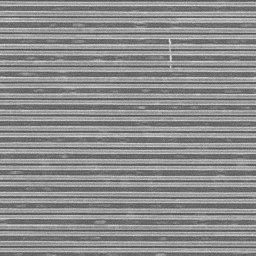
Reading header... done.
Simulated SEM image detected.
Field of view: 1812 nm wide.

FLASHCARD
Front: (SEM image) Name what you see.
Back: parallel lines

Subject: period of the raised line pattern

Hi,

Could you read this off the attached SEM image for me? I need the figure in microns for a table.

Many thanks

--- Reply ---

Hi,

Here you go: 0.0581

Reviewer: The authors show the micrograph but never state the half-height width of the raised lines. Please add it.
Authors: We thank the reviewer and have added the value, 3.63 px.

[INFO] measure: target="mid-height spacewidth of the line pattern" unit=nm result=38.1